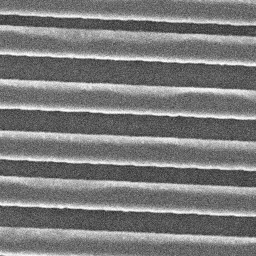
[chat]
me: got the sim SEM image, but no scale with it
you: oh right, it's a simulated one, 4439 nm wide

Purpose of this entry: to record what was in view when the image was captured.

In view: lines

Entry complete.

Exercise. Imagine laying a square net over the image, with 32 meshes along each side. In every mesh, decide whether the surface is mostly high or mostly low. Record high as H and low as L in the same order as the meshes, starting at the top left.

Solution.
HHHHHHHHHHHHHHHHHHHHHHHHHHHHHHHH
HHHHHHHHHHHHHHHHHHHHHHHHHHHHHHHH
LLLLLLLLLLLLLLLLLLLHHHHHHHHHHHHH
HHHLLLLLLLLLLLLLLLLLLLLLLLLLLLLL
HHHHHHHHHHHHHHHHHHHHHHHHHLLLLLLL
HHHHHHHHHHHHHHHHHHHHHHHHHHHHHHHH
HHHHHHHHHHHHHHHHHHHHHHHHHHHHHHHH
LLLLLLLLLLLLLLLLLLHHHHHHHHHHHHHH
LLLLLLLLLLLLLLLLLLLLLLLLLLLLLLLL
LLLLLLLLLLLLLLLLLLLLLLLLLLLLLLLL
HHHHHHHLLLLLLLLLLLLLLLLLLLLLLLLL
HHHHHHHHHHHHHHHHHHHHHHHHHHHHHHHL
HHHHHHHHHHHHHHHHHHHHHHHHHHHHHHHH
HHHHHHHHHHHHHHHHHHHHHHHHHHHHHHHH
LLLLLLLLLLLLLLLLLLLLLLLLLHHHHHHH
LLLLLLLLLLLLLLLLLLLLLLLLLLLLLLLL
LLLLLLLLLLLLLLLLLLLLLLLLLLLLLLLL
HHHHHHHHHHHHHHHHHHHHHHLLLLLLLLLL
HHHHHHHHHHHHHHHHHHHHHHHHHHHHHHHH
HHHHHHHHHHHHHHHHHHHHHHHHHHHHHHHH
LLLLLLLLLLLLLLLHHHHHHHHHHHHHHHHH
LLLLLLLLLLLLLLLLLLLLLLLLLLLLLLLL
HHHHLLLLLLLLLLLLLLLLLLLLLLLLLLLL
HHHHHHHHHHHHHHHHHHHHHHHHHHHLLLLL
HHHHHHHHHHHHHHHHHHHHHHHHHHHHHHHH
HHHHHHHHHHHHHHHHHHHHHHHHHHHHHHHH
LLLLLLLLLLLLLLLLLLLLLLHHHHHHHHHH
LLLLLLLLLLLLLLLLLLLLLLLLLLLLLLLL
LLLLLLLLLLLLLLLLLLLLLLLLLLLLLLLL
HHHHHHHHHHHHHHHHHHLLLLLLLLLLLLLL
HHHHHHHHHHHHHHHHHHHHHHHHHHHHHHHH
HHHHHHHHHHHHHHHHHHHHHHHHHHHHHHHH